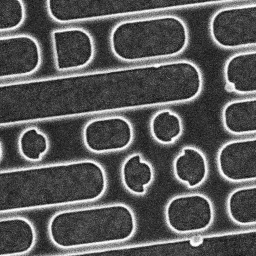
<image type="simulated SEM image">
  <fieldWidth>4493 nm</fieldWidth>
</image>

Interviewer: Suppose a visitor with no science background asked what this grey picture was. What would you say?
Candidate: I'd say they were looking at parallel lines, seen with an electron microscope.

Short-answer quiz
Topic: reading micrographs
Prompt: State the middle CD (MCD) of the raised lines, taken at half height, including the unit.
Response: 0.168 microns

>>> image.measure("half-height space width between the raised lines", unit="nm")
636